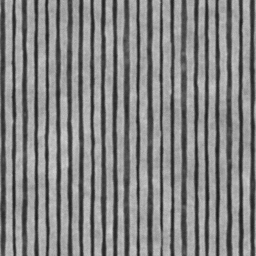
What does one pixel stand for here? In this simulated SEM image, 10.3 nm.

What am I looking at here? parallel lines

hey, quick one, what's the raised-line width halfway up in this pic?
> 77.4 nanometres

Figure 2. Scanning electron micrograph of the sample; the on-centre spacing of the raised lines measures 117 nm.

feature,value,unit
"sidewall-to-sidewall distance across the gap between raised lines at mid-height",0.0387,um